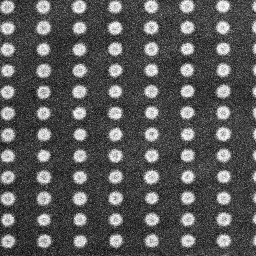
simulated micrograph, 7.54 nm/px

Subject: a regular array of raised bodies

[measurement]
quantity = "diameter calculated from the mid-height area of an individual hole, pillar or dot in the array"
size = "83.7 nanometers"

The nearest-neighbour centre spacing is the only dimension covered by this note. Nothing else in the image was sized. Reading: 160 nm